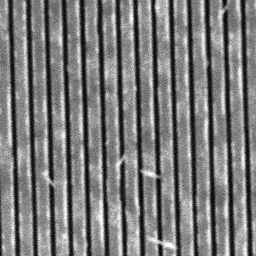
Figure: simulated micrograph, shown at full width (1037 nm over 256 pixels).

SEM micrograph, parallel lines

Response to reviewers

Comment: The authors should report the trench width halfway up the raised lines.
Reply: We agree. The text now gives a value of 22.8 nm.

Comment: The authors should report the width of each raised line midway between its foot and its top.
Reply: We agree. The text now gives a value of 49.6 nm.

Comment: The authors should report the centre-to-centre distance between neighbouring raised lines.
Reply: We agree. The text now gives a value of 72.3 nm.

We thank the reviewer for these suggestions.